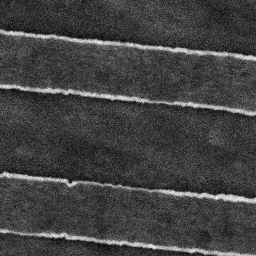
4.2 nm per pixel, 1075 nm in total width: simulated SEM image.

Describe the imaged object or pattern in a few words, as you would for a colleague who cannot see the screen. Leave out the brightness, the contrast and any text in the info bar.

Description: one or a few lines or trenches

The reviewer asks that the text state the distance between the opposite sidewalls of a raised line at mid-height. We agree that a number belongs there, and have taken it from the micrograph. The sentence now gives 240 nanometers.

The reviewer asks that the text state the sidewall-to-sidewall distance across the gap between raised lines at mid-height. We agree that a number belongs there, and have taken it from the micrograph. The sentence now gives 358 nm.